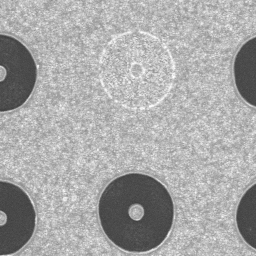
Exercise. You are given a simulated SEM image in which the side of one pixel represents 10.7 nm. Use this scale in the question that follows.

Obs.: ring-shaped grooves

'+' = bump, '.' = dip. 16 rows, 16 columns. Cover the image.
++++++++++++++++
++++++++++++++++
.+++++++++++++++
..+++++++++++++.
..+++++++++++++.
..+++++++++++++.
.+++++++++++++++
++++++++++++++++
++++++++++++++++
++++++++++++++++
++++++++++++++++
.++++++...++++++
..++++.....++++.
..++++..+..++++.
..+++++....++++.
.+++++++..++++++